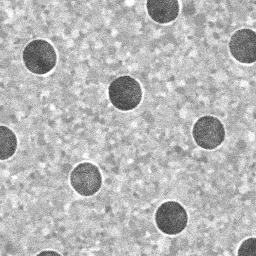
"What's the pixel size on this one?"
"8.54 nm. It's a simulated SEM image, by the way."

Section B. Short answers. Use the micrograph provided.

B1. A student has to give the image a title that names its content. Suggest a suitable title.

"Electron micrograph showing holes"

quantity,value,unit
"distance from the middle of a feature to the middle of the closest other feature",92.8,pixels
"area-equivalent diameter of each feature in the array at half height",34.4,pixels